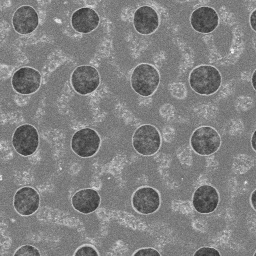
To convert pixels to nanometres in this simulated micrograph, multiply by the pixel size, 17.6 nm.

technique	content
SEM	a regular array of holes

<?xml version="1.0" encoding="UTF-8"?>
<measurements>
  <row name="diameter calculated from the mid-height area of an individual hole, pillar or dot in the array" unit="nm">488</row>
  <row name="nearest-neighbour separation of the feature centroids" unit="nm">1030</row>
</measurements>